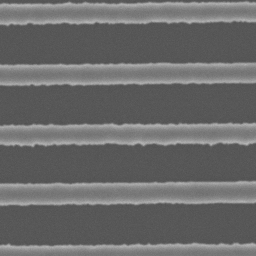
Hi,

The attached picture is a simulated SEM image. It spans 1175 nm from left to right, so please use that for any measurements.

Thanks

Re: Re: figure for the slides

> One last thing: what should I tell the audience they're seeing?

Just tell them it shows lines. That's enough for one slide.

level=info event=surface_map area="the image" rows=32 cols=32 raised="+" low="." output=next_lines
........+.+++..+.+++++++++++++++
++++++++++++++++++++++++++++++++
++++++++++++++++++++++++++++++++
................................
................................
................................
................................
................................
++++++++++++++++++++++++++++++++
++++++++++++++++++++++++++++++++
++++++++++++++++.+..............
................................
................................
................................
................................
............................+..+
++++++++++++++++++++++++++++++++
++++++++++++++++++++++++++++++++
................................
................................
................................
................................
................................
++++++++++++++++++++++++++++++++
++++++++++++++++++++++++++++++++
++++++++++++++..+...............
................................
................................
................................
................................
........................+......+
++++++++++++++++++++++++++++++++